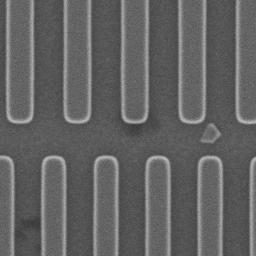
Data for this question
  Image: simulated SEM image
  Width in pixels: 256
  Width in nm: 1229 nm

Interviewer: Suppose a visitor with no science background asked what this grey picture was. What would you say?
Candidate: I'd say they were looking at groups of lines, slits or small figures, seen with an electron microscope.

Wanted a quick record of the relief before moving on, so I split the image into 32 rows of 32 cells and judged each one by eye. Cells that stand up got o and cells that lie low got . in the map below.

.ooo....ooo....ooo....oooo....oo
.ooo....ooo....ooo....oooo....oo
.ooo....ooo....ooo....oooo....oo
.ooo....ooo....ooo....oooo....oo
.ooo....ooo....ooo....oooo....oo
.ooo....ooo....ooo.....ooo....oo
.ooo....ooo....ooo.....ooo....oo
.ooo....ooo....ooo.....ooo....oo
.ooo....ooo....ooo.....ooo....oo
.ooo....ooo....ooo.....ooo....oo
.ooo....ooo....ooo.....ooo....oo
.ooo....ooo....ooo....oooo....oo
.ooo....ooo....ooo....oooo....oo
.ooo....ooo....ooo....oooo....oo
.ooo....ooo....ooo.....oo.....oo
................................
................................
................................
................................
................................
oo...ooo....ooo...ooo....ooo...o
oo...ooo....ooo...ooo....ooo...o
oo...ooo....ooo...ooo....ooo...o
oo...ooo....ooo...ooo....ooo...o
oo...ooo....ooo...ooo....ooo...o
oo...ooo....ooo...ooo....ooo...o
oo...ooo....ooo...ooo....ooo...o
oo...ooo....ooo...ooo....ooo...o
oo...ooo....ooo...ooo....ooo...o
oo...ooo....ooo...ooo....ooo...o
oo...ooo....ooo...ooo....ooo...o
oo...ooo....ooo...ooo....ooo...o